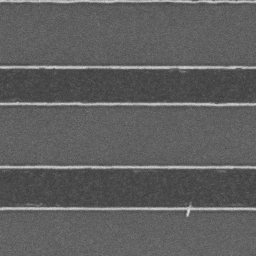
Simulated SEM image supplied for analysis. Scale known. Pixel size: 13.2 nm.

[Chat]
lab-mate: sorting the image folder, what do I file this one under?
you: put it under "one or a few lines or trenches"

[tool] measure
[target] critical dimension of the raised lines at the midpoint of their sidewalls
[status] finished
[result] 40.1 pixels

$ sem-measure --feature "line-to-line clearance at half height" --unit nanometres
847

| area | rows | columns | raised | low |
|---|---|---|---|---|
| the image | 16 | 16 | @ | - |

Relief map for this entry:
----------------
----------------
----------------
----------------
@@@@@@@@@@@@@@@@
@@@@@@@@@@@@@@@@
@@@@@@@@-@@-@@@@
----------------
----------------
----------------
@@@@@@@@@@@@-@@@
@@@@@@@@@@@@@@@@
@@@@@@@@@@@@@@@@
----------------
----------------
----------------